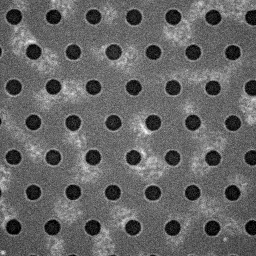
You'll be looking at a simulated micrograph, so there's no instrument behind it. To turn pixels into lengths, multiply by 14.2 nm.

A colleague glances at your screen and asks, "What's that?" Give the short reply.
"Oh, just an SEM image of a regular array of holes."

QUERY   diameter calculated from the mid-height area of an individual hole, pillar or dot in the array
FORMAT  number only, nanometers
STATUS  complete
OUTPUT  234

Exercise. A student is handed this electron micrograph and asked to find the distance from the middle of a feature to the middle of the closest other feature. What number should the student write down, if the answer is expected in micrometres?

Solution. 0.565